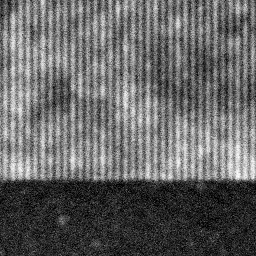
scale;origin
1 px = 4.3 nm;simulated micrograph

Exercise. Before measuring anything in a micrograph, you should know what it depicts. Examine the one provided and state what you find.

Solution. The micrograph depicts parallel lines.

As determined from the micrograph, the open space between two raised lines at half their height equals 4.63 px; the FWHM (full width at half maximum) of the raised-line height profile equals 11.8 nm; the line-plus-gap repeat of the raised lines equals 0.0322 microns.